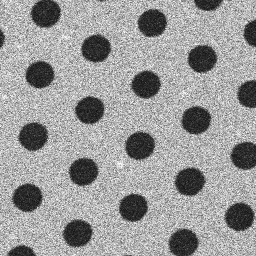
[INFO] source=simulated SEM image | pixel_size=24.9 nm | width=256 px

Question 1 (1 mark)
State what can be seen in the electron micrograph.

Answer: a regular array of holes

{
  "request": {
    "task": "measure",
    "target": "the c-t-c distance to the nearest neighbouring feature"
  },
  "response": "1530 nanometers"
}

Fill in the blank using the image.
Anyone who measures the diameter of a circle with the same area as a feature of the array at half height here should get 0.723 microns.